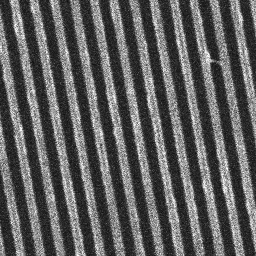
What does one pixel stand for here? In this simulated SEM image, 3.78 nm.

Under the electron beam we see parallel lines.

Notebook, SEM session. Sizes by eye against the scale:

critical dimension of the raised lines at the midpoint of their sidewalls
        8.86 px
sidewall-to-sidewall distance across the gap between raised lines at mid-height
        40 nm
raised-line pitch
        74.2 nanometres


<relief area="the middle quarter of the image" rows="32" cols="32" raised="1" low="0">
11001110011100110001110011100111
11000110001100011001110001100011
11000110001100011000110001100011
11000110001100011000110001100011
11000110001100011000110001100011
11100111001100011000111001110011
11100011000110011100011000110011
01100011000110001100011000110001
01100011000110001100011000110001
01100011000110001100011000110001
01110011000110001100011000110001
00110001100111001110011100111001
00110001100011000110011100111000
00110001100011000110001100011000
00110001100011000110001100011000
00110001100011100110001100011000
00111001110011000110001110011100
00111000110001100111001110011100
00011000110001100011000110001100
00011000110001100011000110001100
00011000110001100011000110001100
00011100110001110011000110001100
10001100011001110011100111001110
10001100011000110001100111001110
10001100011000110001100011000110
10001100011000110001100011000110
10001100011000110001100011000110
11001110011100110001100011000111
11001110001100011001110011100011
11000110001100011000110001100011
11000110001100011000110001100011
11000110001100011000110001100011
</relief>